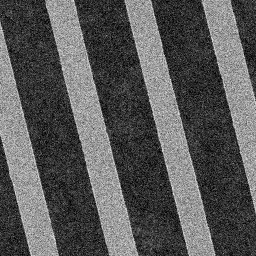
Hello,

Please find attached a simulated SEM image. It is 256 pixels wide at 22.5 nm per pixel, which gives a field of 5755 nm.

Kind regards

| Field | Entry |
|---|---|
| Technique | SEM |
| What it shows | one or a few lines or trenches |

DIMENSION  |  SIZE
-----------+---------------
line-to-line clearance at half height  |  1110 nm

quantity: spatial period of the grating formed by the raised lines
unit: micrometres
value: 1.71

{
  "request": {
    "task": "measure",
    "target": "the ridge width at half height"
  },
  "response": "26.9 px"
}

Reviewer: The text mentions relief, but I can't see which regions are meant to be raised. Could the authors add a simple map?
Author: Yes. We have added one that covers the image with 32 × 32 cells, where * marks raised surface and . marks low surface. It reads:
......***.......***......****...
......****......***.......***...
......****......***.......***...
.......***.......***......****..
.......***.......***......****..
*......****......***.......***..
*......****......***.......***..
*.......***......****......****.
*.......***.......***......****.
**......****......***.......***.
**......****......***.......***.
**.......***.......***......****
**.......***.......***......****
***......****......***.......***
***......****......***.......***
***.......***......****......***
***.......***.......***......***
****......****......***.......**
.***......****......***.......**
.***.......***......****......**
.***.......***.......***......**
.****......****......***.......*
.****......****......****......*
..***.......***.......***......*
..***.......***.......***.......
..****......****......***.......
...***......****......****......
...***.......***.......***......
...***.......***.......***......
...****......****......***......
....***......****......****.....
....***.......***.......***.....